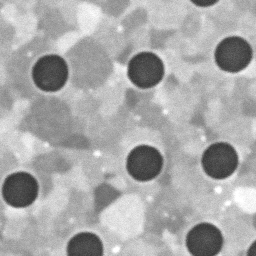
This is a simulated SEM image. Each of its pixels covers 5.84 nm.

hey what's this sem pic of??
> holes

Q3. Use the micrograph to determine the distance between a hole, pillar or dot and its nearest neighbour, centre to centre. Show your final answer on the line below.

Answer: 519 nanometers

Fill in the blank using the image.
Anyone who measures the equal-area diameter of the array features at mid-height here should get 229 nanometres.